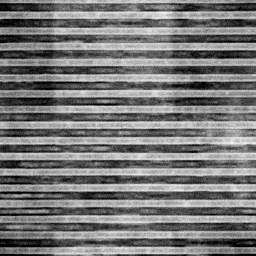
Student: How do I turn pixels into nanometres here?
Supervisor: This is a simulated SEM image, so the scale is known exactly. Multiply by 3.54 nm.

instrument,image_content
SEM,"parallel lines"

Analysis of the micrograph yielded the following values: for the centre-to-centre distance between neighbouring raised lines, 55.5 nanometers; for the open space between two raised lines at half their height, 31.9 nm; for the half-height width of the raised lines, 25.2 nm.